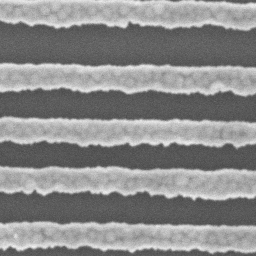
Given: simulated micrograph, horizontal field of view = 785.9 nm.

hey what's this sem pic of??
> lines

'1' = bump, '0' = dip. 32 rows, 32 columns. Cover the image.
11111111111111111111111111111001
11111111111111111111111111111111
11111111111111111111111111111111
00000000000000000000000000000111
00000000000000000000000000000000
00000000000000000000000000000000
00000000000000000000000000000000
00000000000000000000000000000000
11111111111111111111111111111100
11111111111111111111111111111111
11111111111111111111111111111111
00000000001000001000011101100111
00000000000000000000000000000000
00000000000000000000000000000000
00000000000000000000000000000000
11111111111111111111111111111111
11111111111111111111111111111111
11111111111111111111111111111111
00000000000000000000000000000000
00000000000000000000000000000000
00000000000000000000000000000000
11111111111111111111111111111111
11111111111111111111111111111111
11111111111111111111111111111111
00000000000000000000010111111111
00000000000000000000000000000000
00000000000000000000000000000000
00000000000000000000000000000000
11111111111111111111111111111111
11111111111111111111111111111111
11111111111111111111111111111111
00000000000000000000000000100010